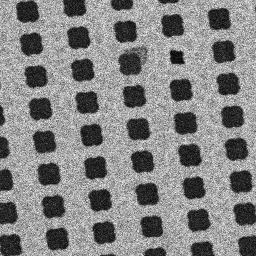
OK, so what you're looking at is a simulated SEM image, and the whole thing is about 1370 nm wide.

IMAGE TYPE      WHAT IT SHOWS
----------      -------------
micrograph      a regular array of holes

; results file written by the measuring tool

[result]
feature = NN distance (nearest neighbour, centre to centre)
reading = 32.7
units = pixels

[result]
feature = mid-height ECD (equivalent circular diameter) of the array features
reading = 123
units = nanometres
